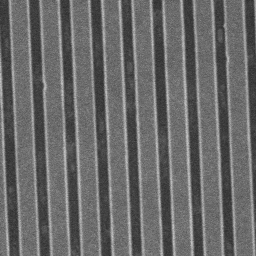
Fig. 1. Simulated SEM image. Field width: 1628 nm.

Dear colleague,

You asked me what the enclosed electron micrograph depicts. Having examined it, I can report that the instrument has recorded parallel lines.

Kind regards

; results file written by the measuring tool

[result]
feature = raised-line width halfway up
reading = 123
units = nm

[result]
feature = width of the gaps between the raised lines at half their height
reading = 70.6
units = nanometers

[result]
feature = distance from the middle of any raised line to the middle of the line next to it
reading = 30.7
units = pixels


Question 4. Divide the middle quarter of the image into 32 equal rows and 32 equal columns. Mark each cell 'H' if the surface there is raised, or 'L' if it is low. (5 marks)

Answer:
LLHHHHHLLLHHHHHLLLHHHHLLLHHHHHLL
LLHHHHHLLLHHHHHLLLHHHHLLLHHHHHLL
LLLHHHHLLLHHHHHLLLHHHHLLLHHHHHLL
LLLHHHHLLLHHHHHLLLHHHHLLLHHHHHLL
LLLHHHHLLLHHHHHLLLHHHHHLLLHHHHLL
LLLHHHHLLLHHHHHLLLHHHHHLLLHHHHLL
LLLHHHHLLLHHHHHLLLHHHHHLLLHHHHLL
LLLHHHHLLLHHHHHLLLHHHHHLLLHHHHHL
LLLHHHHLLLHHHHHLLLHHHHHLLLHHHHHL
LLLHHHHLLLHHHHHLLLHHHHHLLLHHHHHL
LLLHHHHHLLLHHHHLLLHHHHHLLLHHHHHL
LLLHHHHHLLLHHHHLLLHHHHHLLLHHHHHL
LLLHHHHHLLLHHHHLLLHHHHHLLLHHHHHL
LLLHHHHHLLLHHHHLLLHHHHHLLLHHHHHL
LLLHHHHHLLLHHHHLLLHHHHHLLLHHHHHL
LLLHHHHHLLLHHHHLLLHHHHHLLLHHHHHL
LLLHHHHHLLLHHHHLLLHHHHHLLLHHHHHL
LLLHHHHHLLLHHHHLLLHHHHHLLLHHHHHL
LLLHHHHHLLLHHHHLLLHHHHHLLLHHHHHL
LLLHHHHHLLLHHHHHLLLHHHHLLLHHHHHL
LLLHHHHHLLLHHHHHLLLHHHHLLLHHHHHL
LLLHHHHHLLLHHHHHLLLHHHHLLLHHHHHL
LLLHHHHHLLLHHHHHLLLHHHHLLLLHHHHL
LLLHHHHHLLLHHHHHLLLHHHHLLLLHHHHL
LLLHHHHHLLLHHHHHLLLHHHHLLLLHHHHL
LLLLHHHHLLLHHHHHLLLHHHHLLLLHHHHL
LLLLHHHHLLLHHHHHLLLHHHHLLLLHHHHL
LLLLHHHHLLLHHHHHLLLHHHHHLLLHHHHL
LLLLHHHHLLLHHHHHLLLHHHHHLLLHHHHL
LLLLHHHHLLLHHHHHLLLHHHHHLLLHHHHL
HLLLHHHHLLLHHHHHLLLHHHHHLLLHHHHH
HLLLHHHHLLLHHHHHLLLHHHHHLLLHHHHH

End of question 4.